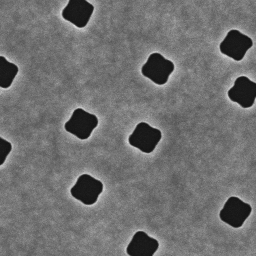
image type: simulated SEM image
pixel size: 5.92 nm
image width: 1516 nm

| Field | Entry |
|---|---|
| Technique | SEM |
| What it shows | holes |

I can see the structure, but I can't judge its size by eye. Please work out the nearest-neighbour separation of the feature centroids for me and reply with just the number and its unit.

0.402 microns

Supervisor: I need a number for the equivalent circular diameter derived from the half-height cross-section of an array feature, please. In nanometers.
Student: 174